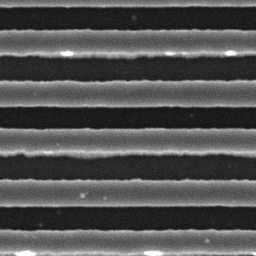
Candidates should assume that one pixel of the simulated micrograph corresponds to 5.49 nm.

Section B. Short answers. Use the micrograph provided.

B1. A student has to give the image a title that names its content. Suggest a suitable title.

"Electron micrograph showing lines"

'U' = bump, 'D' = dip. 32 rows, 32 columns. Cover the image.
UUUUUUUUUUUUUUUUUUUUUUUUUUUUUUUU
DDDDDDDDDDDDDDDDDDDDDDDDDDDDDDDD
DDDDDDDDDDDDDDDDDDDDDDDDDDDDDDDD
DDDDDDDDDDDDDDDDDDDDDDDDDDDDDDDD
UUUUUUUUUUUUUUUUUUUUUUUUUUUUUUUU
UUUUUUUUUUUUUUUUUUUUUUUUUUUUUUUU
UUUUUUUUUUUUUUUUUUUUUUUUUUUUUUUU
DDDDDDDDDDDDDDDDDDDDDDDDDDDDDDDD
DDDDDDDDDDDDDDDDDDDDDDDDDDDDDDDD
DDDDDDDDDDDDDDDDDDDDDDDDDDDDDDDD
UUUUUUUUUUUUUUUUUUUUUUUUUUUUUUUU
UUUUUUUUUUUUUUUUUUUUUUUUUUUUUUUU
UUUUUUUUUUUUUUUUUUUUUUUUUUUUUUUU
DDDDDDDDDDDDDDDDDDDDDDDDDDDDDDDD
DDDDDDDDDDDDDDDDDDDDDDDDDDDDDDDD
DDDDDDDDDDDDDDDDDDDDDDDDDDDDDDDD
UUUUUUUUUUUUUUUUUUUUUUUUUUUUUUUU
UUUUUUUUUUUUUUUUUUUUUUUUUUUUUUUU
UUUUUUUUUUUUUUUUUUUUUUUUUUUUUUUU
DDDDDDDDDDDDDDDDDDDDDDDDDDDDDDDD
DDDDDDDDDDDDDDDDDDDDDDDDDDDDDDDD
DDDDDDDDDDDDDDDDDDDDDDDDDDDDDDDD
DDDDDDDDDDDDDDDDDDDDDDDDDDDDDDDD
UUUUUUUUUUUUUUUUUUUUUUUUUUUUUUUU
UUUUUUUUUUUUUUUUUUUUUUUUUUUUUUUU
UUUUUUUUUUUUUUUUUUUUUUUUUUUUUUUU
DDDDDDDDDDDDDDDDDDDDDDDDDDDDDDDD
DDDDDDDDDDDDDDDDDDDDDDDDDDDDDDDD
DDDDDDDDDDDDDDDDDDDDDDDDDDDDDDDD
UUUUUUUUUUUUUUUUUUUUUUUUUUUUUUUU
UUUUUUUUUUUUUUUUUUUUUUUUUUUUUUUU
UUUUUUUUUUUUUUUUUUUUUUUUUUUUUUUU